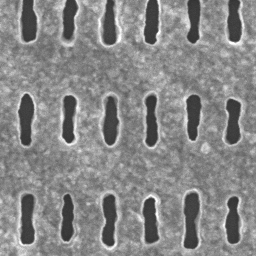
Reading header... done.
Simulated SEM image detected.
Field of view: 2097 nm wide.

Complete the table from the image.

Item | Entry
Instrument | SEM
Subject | a regular array of holes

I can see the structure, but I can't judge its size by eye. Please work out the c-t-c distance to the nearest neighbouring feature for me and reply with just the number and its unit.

334 nanometers